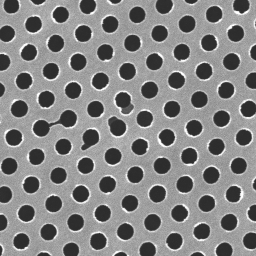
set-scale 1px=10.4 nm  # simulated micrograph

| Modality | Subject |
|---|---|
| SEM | a regular array of holes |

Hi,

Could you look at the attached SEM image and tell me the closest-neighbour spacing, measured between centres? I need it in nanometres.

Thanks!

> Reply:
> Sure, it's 295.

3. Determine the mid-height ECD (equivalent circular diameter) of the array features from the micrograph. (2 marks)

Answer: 172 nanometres